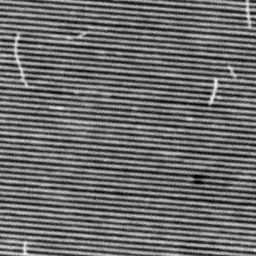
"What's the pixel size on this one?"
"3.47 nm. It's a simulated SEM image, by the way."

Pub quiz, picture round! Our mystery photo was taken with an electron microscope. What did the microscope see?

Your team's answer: parallel lines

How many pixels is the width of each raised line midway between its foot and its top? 2.62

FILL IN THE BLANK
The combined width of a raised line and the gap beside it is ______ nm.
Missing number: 20.7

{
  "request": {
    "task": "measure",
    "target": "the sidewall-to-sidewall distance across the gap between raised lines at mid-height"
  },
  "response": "0.0112 microns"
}